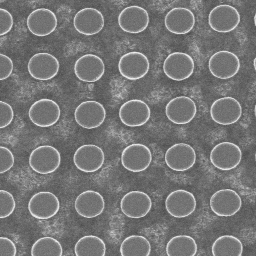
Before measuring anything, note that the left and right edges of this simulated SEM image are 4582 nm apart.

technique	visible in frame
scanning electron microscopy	a regular array of raised bodies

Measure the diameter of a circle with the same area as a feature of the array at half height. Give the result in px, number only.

28.4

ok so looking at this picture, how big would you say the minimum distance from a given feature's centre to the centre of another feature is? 796 nm